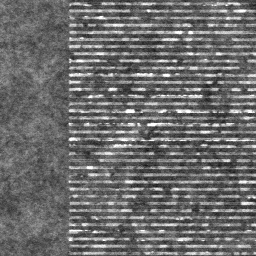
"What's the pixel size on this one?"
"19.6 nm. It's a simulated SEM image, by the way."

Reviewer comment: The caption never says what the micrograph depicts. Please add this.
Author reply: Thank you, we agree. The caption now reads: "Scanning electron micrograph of parallel lines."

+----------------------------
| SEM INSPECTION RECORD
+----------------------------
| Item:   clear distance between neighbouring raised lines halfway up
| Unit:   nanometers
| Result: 110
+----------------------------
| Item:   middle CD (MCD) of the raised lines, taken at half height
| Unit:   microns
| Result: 0.0368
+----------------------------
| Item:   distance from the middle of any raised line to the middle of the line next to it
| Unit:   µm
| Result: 0.14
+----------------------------